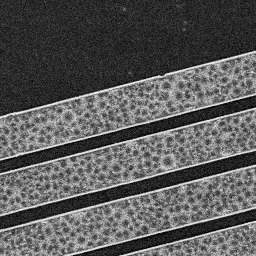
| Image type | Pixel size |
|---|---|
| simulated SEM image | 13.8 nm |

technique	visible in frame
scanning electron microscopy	parallel lines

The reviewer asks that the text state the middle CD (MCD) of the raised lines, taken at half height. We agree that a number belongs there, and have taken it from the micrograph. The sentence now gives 547 nanometres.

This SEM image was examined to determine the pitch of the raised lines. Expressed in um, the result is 0.757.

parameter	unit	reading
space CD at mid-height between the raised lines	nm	191